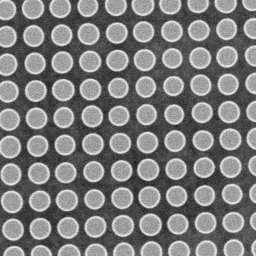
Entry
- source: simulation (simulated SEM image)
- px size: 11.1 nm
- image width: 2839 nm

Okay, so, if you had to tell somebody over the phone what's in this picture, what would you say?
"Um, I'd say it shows an array of small figures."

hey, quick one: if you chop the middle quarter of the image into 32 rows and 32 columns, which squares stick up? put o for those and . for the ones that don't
oo..ooooo..oooo...oooo....ooo...
o....ooo....oo......o...........
................................
...................ooo....ooo...
o....ooo....ooo...oooo...ooooo..
oo..ooooo..ooooo..ooooo..ooooo..
oo..ooooo..ooooo..ooooo..ooooo..
oo..ooooo...ooo....ooo....ooo...
oo...ooo........................
................................
...................ooo....oo....
o....oooo...oooo..ooooo...oooo..
oo...oooo..ooooo..ooooo..ooooo..
oo...oooo..ooooo..ooooo...oooo..
oo...oooo...oooo...ooo....ooo...
o.....oo........................
................................
.............oo....ooo....oooo..
oo...oooo...oooo...oooo..ooooo..
ooo..ooooo..oooo..ooooo..ooooo..
ooo..ooooo..oooo...oooo...oooo..
oo...oooo...oooo...oooo...ooo...
o.....oo........................
................................
.......o.....ooo...oooo...oooo..
oo...oooo...ooooo..oooo...oooo..
ooo..ooooo..ooooo..ooooo..oooo..
ooo..ooooo..ooooo..oooo...oooo..
ooo..oooo....ooo...oooo....oo...
o...............................
................................
.............ooo...oooo...oooo..